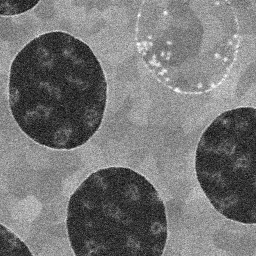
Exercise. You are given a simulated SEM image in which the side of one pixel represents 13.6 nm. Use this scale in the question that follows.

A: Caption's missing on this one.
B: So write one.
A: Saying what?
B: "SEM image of holes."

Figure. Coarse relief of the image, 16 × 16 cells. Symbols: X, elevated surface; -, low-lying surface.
--XXXXXXXXXXXXXX
XXXXXXXXXXXXXXXX
XX---XXXXXXXXXXX
X-----XXXXXXXXXX
X-----XXXXXXXXXX
X------XXXXXXXXX
X------XXXXXXXXX
X-----XXXXXXX---
XX----XXXXXXX---
XXXXXXXXXXXX----
XXXXXXX-XXXX----
XXXXX----XXX----
XXXX------XXX---
XXXX------XXXX--
-XXX------XXXXXX
--XX------XXXXXX